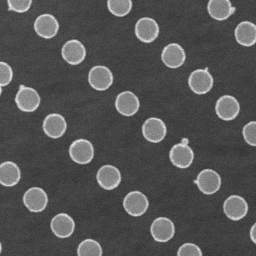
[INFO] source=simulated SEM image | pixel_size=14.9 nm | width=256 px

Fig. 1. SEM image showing a regular array of raised bodies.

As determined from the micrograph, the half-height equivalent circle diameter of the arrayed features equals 23.3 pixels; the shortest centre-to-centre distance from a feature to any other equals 556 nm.